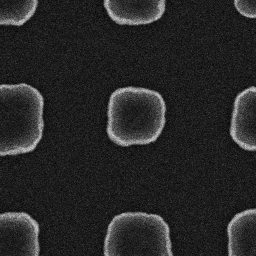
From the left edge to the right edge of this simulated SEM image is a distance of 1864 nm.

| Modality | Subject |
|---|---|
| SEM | raised bodies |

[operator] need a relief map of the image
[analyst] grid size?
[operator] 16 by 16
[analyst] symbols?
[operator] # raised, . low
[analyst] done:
##.....###.....#
................
................
................
................
##..............
###....###.....#
###....###.....#
##.....###.....#
#...............
................
................
................
##......##.....#
##.....###....##
##.....####...##